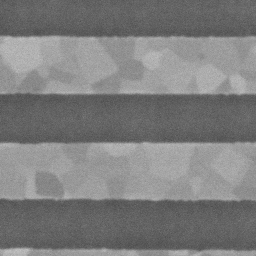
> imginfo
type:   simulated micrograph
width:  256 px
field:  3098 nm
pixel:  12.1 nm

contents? lines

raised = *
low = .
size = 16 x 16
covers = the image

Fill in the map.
................
................
****************
****************
****************
****************
................
................
................
****************
****************
****************
.........*.*..**
................
................
................